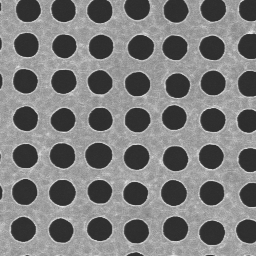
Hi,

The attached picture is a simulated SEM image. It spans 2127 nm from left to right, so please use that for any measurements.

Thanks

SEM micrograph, a regular array of holes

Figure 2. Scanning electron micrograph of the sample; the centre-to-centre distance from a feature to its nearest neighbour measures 297 nm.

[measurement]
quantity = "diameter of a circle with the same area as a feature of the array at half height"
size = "207 nanometres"